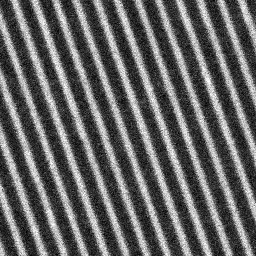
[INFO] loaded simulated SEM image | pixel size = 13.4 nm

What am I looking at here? parallel lines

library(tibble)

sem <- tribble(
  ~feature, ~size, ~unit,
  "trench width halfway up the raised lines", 55.3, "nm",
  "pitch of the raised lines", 19.4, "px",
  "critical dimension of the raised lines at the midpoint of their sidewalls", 204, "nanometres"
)